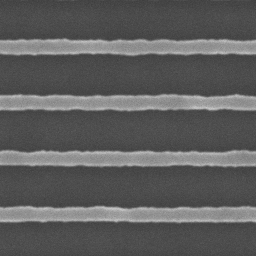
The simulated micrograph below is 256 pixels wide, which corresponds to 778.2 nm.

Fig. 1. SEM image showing lines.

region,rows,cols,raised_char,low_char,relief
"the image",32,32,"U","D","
DDDDDDDDDDDDDDDDDDDDDDDDDDDDDDDD
DDDDDDDDDDDDDDDDDDDDDDDDDDDDDDDD
DDDDDDDDDDDDDDDDDDDDDDDDDDDDDDDD
DDDDDDDDDDDDDDDDDDDDDDDDDDDDDDDD
DDDDDDDDDDDDDDDDDDDDDDDDDDDDDDDD
UUUUUUUUUUUUUUUUUUUUUUUUUUUUUUUU
UUUUUUUUUUUUUUUUUUUUUUUUUUUUUUUU
DDDDDDDDDDDDDDDDDDDDDDDDDDDDDDDD
DDDDDDDDDDDDDDDDDDDDDDDDDDDDDDDD
DDDDDDDDDDDDDDDDDDDDDDDDDDDDDDDD
DDDDDDDDDDDDDDDDDDDDDDDDDDDDDDDD
DDDDDDDDDDDDDDDDDDDDDDDDDDDDDDDD
UUUUUUUUUUUUUUUUUUUUUUUUUUUUUUUU
UUUUUUUUUUUUUUUUUUUUUUUUUUUUUUUU
DDDDDDDDDDDDDDDDDDDDDDDDDDDDDDDD
DDDDDDDDDDDDDDDDDDDDDDDDDDDDDDDD
DDDDDDDDDDDDDDDDDDDDDDDDDDDDDDDD
DDDDDDDDDDDDDDDDDDDDDDDDDDDDDDDD
DDDDDDDDDDDDDDDDDDDDDDDDDDDDDDDD
UUUUUUUUUUUUUUUUUUUUUUUUUUUUUUUU
UUUUUUUUUUUUUUUUUUUUUUUUUUUUUUUU
DDDDDDDDDDDDDDDDDDDDDDDDDDDDDDDD
DDDDDDDDDDDDDDDDDDDDDDDDDDDDDDDD
DDDDDDDDDDDDDDDDDDDDDDDDDDDDDDDD
DDDDDDDDDDDDDDDDDDDDDDDDDDDDDDDD
DDDDDDDDDDDDDDDDDDDDDDDDDDDDDDDD
UUUUUUUUUUUUUUUUUUUUUUUUUUUUUUUU
UUUUUUUUUUUUUUUUUUUUUUUUUUUUUUUU
DDDDDDDDDDDDDDDDDDDDDDDDDDDDDDDD
DDDDDDDDDDDDDDDDDDDDDDDDDDDDDDDD
DDDDDDDDDDDDDDDDDDDDDDDDDDDDDDDD
DDDDDDDDDDDDDDDDDDDDDDDDDDDDDDDD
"